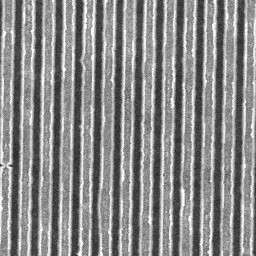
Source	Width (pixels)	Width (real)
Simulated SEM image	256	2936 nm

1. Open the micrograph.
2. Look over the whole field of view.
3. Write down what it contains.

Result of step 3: parallel lines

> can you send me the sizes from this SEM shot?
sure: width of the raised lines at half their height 0.132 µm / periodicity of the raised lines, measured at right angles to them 20.2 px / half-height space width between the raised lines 98.9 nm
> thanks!